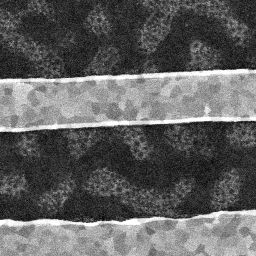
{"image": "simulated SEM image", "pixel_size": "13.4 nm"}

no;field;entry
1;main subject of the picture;one or a few lines or trenches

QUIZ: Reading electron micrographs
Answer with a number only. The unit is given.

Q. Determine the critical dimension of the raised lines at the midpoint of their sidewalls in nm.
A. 643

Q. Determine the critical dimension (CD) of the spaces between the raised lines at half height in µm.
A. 1.3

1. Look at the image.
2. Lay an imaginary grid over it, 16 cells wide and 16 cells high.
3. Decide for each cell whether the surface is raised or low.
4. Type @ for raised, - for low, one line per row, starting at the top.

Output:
----------------
----------------
----------------
----------------
--------------@@
@@@@@@@@@@@@@@@@
@@@@@@@@@@@@@@@@
@@@@@@@@@@@@----
----------------
----------------
----------------
----------------
----------------
-------------@@@
@@@@@@@@@@@@@@@@
@@@@@@@@@@@@@@@@